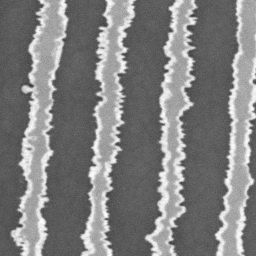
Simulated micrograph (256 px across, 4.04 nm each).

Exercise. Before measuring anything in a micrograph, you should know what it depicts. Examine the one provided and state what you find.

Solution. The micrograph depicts one or a few lines or trenches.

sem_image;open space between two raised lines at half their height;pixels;47.3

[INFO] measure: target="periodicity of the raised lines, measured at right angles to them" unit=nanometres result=268